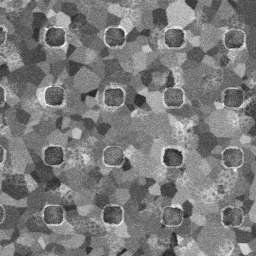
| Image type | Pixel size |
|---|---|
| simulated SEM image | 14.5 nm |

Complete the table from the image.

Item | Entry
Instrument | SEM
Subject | a regular array of holes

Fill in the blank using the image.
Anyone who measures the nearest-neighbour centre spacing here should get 856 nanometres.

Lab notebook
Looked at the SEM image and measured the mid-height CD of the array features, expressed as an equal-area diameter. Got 21 px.